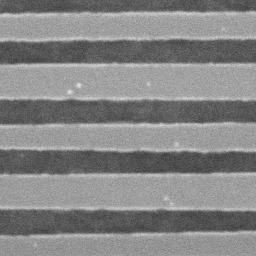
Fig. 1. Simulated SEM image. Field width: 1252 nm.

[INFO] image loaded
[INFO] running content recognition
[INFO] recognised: lines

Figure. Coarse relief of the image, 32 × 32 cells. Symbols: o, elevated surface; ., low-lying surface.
................................
......................o........o
oooooooooooooooooooooooooooooooo
oooooooooooooooooooooooooooooooo
oooooooooooooooooooooooooooooooo
................................
................................
................................
oooooooooooooooooooooooooooooooo
oooooooooooooooooooooooooooooooo
oooooooooooooooooooooooooooooooo
oooooooooooooooooooooooooooooooo
..............................o.
................................
................................
......................ooo.oooooo
oooooooooooooooooooooooooooooooo
oooooooooooooooooooooooooooooooo
oooooooooooooooooooooooooooooooo
................................
................................
................................
oooooooooooooooooooooooooooooooo
oooooooooooooooooooooooooooooooo
oooooooooooooooooooooooooooooooo
oooooooooooooooooooooooooooooooo
................................
................................
................................
....oooooooooooooooooooooooooooo
oooooooooooooooooooooooooooooooo
oooooooooooooooooooooooooooooooo